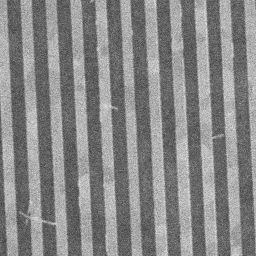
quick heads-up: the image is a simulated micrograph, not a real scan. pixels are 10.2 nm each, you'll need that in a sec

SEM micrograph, parallel lines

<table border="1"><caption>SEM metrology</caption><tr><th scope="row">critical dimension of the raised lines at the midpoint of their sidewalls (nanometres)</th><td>108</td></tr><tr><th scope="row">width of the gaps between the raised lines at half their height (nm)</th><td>147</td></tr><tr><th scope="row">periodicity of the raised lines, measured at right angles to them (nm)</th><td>254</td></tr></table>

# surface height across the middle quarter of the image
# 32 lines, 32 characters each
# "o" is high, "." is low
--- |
...oo....oo....oo....oo....ooo..
...oo....oo....oo....oo.....oo..
...oo....oo....oo....ooo....oo..
...oo....oo....oo....ooo....oo..
...oo....oo....oo....ooo....oo..
...oo....oo....oo....ooo....oo..
...oo....oo....oo.....oo....oo..
...oo....ooo...ooo....oo....oo..
...oo....ooo...ooo....oo....oo..
...oo....ooo...ooo....oo....oo..
...oo....ooo...ooo....oo....oo..
...oo....ooo....oo....oo....oo..
...oo....ooo....oo....oo....oo..
...ooo...ooo....oo....oo....oo..
...ooo...ooo....oo....oo....oo..
...ooo...ooo....oo....oo....oo..
...ooo...ooo....oo....oo....oo..
...ooo....oo....oo....oo....oo..
...ooo....oo....oo....oo....oo..
...ooo....oo....oo....oo....ooo.
...ooo....oo....oo....oo....ooo.
...ooo....oo....oo....oo....ooo.
....oo....oo....oo....oo....ooo.
....oo....oo....oo....oo.....oo.
....oo....oo....oo....ooo....oo.
....oo....oo....oo....ooo....oo.
....oo....oo....oo....ooo....oo.
....oo....oo....oo....ooo....oo.
....oo....oo....oo.....oo....oo.
....oo....ooo...ooo....oo....oo.
....oo....ooo...ooo....oo....oo.
....oo....oo....ooo....oo....oo.